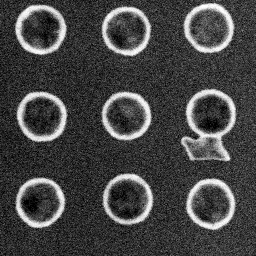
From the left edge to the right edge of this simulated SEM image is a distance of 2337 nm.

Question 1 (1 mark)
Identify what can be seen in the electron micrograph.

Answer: a regular array of raised bodies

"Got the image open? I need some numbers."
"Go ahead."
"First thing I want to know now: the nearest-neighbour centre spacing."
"763 nm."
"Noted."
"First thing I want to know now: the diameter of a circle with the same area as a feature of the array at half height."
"45.5 px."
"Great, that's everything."